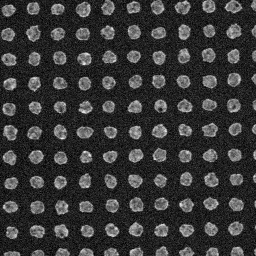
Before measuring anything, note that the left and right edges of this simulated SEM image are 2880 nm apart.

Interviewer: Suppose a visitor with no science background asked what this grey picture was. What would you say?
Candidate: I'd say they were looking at a regular array of raised bodies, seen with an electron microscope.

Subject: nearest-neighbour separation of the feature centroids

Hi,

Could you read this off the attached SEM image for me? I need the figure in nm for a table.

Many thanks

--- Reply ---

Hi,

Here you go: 272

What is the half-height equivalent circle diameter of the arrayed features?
140 nm